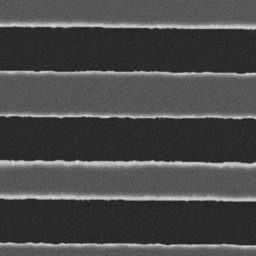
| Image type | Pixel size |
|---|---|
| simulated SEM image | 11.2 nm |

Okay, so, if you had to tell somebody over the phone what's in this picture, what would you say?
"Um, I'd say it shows lines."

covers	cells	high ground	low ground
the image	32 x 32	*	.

********************************
********************************
********************************
..................**..**********
................................
................................
................................
................................
................................
********************************
********************************
********************************
********************************
********************************
********************************
................................
................................
................................
................................
................................
********************************
********************************
********************************
********************************
********************************
................................
................................
................................
................................
................................
**.***..........................
********************************